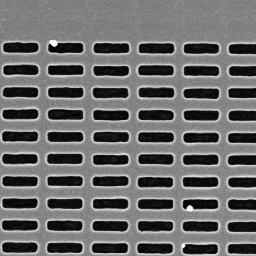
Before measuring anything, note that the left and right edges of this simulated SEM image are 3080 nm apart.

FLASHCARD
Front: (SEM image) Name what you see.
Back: a regular array of holes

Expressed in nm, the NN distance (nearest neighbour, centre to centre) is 266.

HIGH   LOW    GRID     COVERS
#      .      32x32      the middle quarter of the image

....####.#...#..###........###..
.....##.........###........###..
.....###........###........###..
################################
################################
################################
.....##.........###........###..
.....##.........###.........##..
....####....#.#########....###..
################################
################################
....####..####.#####......#####.
.....##.........##.........###..
.....##.........###........###..
################################
################################
################################
.....##.........###........###..
.....##.........##..........##..
....####.......####........###..
################################
################################
....################.......#####
.....##.........###.........##..
.....##.........###........###..
################################
################################
################################
....####........###........###..
.....##.........##.........###..
....####......#####........###..
################################